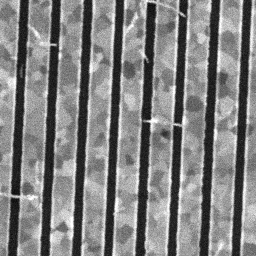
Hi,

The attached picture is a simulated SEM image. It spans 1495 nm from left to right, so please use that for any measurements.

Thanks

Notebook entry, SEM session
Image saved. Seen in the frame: parallel lines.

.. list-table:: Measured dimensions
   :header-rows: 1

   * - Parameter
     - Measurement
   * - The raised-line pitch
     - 0.186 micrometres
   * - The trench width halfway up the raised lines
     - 0.0613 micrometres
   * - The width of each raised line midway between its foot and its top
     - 123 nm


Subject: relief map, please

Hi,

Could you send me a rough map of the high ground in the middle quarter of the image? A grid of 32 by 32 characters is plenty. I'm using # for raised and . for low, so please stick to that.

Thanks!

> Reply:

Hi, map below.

####...#####...#####...#####...#
####...#####..######...#####...#
####...#####..######...#####...#
####...#####..######...#####..##
####...#####..######...#####..##
####..######..######..######..##
####..######..######..#####...##
####..######..######..#####...##
###...######..#####...#####...##
###...######..#####...#####...##
####..#####...#####...#####...##
###...#####...#####...#####...##
###...#####...#####...#####...##
###...#####...#####...#####...##
###...#####...#####...#####...##
###...#####...#####...#####...##
###...#####...#####...#####...##
###...#####...#####...#####...##
###...#####...#####...#####...##
###...#####...#####...#####...##
###...#####...#####...#####...##
###...#####...#####...#####...##
###...#####...#####...#####...##
###...#####...#####...#####...##
###...#####..######...#####..###
###...#####..######...#####..###
###...#####..######..######..###
###...#####...#####..######..###
##....#####..######..#####...###
###..######..#####...######..###
###..######..#####...#####...###
###..#####...#####...#####...###